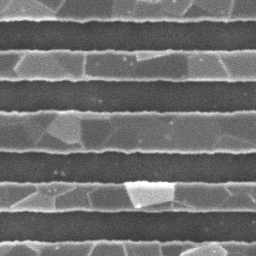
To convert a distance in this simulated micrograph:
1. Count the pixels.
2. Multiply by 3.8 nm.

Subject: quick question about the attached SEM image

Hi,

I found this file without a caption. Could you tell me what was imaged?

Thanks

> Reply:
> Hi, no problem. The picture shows lines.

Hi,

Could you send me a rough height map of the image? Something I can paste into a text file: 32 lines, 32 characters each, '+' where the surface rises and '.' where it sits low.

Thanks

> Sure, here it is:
++++++++++++++++++++++++++++++++
++++++++++++++++++++++++++++++++
++++++++++++++++++++++++++++++++
................................
................................
................................
++++++++++++++++++++++++++++++++
++++++++++++++++++++++++++++++++
++++++++++++++++++++++++++++++++
++++++++++++++++++++++++++++++++
................................
................................
................................
................................
++++++++++++++++++++++++++++++++
++++++++++++++++++++++++++++++++
++++++++++++++++++++++++++++++++
++++++++++++++++++++++++++++++++
++++++++++++++++++++++++++++++++
................................
................................
................................
................................
++++++++++++++++++++++++++++++++
++++++++++++++++++++++++++++++++
++++++++++++++++++++++++++++++++
................................
................................
................................
................................
++++++++++++++++++++++++++++++++
++++++++++++++++++++++++++++++++